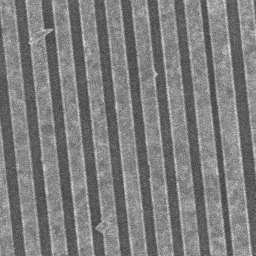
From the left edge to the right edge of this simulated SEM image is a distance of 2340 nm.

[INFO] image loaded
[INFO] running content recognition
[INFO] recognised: parallel lines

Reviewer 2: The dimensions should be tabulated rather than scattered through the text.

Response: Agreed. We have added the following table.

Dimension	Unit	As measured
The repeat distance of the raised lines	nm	238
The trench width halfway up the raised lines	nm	112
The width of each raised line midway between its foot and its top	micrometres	0.127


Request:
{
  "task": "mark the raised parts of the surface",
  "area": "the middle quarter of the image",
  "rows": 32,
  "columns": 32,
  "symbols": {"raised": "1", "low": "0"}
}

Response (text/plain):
11000011100011110001110001111000
11000011100011110001110001111000
11100011100011110001111000111000
11100011100011110001110000111000
11100011100001110001111000111000
11100011100001110001111000111100
11100011110001110001111000111100
11100001110001110001111000111100
11100001110001110000111000111100
11100001110001110000111000111100
11100001110001111000111000111100
11100001110001111000111000011100
11110001110001111000111000011100
11110001110000111000111000011100
11110001110000111000111100011100
01110001110000111000111100011100
01110001111000111000111100011110
01110001111000111000011100011110
01110001111000111000011100011110
01110000111000111000011100011110
01110000111000111100011100001110
01111000111000111100011100001110
01111000111000111100011100001110
01111000111000011100011110001110
01111000111000011100011110001110
00111000111100011100001110001111
00111000011100011100001110001111
00111000011100011100001110001111
00111000011100011100001110001111
00111000011100011110001110001111
00111000011100011110001110000111
00111100011100011110001110000111